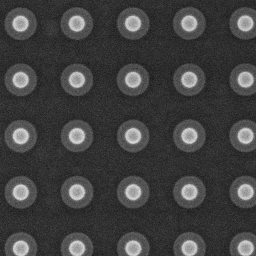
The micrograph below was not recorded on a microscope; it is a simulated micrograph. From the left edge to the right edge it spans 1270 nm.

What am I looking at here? an array of small figures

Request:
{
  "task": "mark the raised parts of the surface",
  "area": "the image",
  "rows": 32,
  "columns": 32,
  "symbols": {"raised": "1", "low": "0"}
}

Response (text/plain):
00000000000000000000000000000000
01110000111000011100001110000111
01111000111100011110001111000111
01111000111100011110001111000111
01110000111000011100001110000011
00000000000000000000000000000000
00000000000000000000000000000000
00000000000000000000000000000000
01110000111000011100001110000111
01111000111100011110001111000111
01111000111100011110001111000111
01110000111000011100001110000111
00000000000000000000000000000000
00000000000000000000000000000000
00000000000000000000000000000000
01110000111000011100001110000111
01111000111100011110001111000111
01111000111100011110001111000111
01110000111000011100001110000111
00000000000000000000000000000000
00000000000000000000000000000000
00000000000000000000000000000000
01110000111000011100001110000111
01111000111100011110001111000111
01111000111100011110001111000111
01110000111000011100001110000111
00000000000000000000000000000000
00000000000000000000000000000000
00000000000000000000000000000000
01110000111000011100001110000111
01111000111100011110001111000111
01111000111100011110001111000111